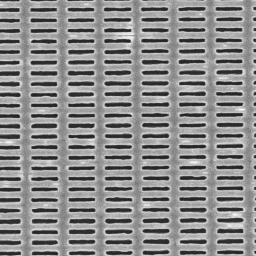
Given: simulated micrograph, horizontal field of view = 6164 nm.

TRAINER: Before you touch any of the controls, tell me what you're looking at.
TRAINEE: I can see a regular array of holes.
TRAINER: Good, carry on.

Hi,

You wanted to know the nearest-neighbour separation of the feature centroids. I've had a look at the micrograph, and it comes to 247 nm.